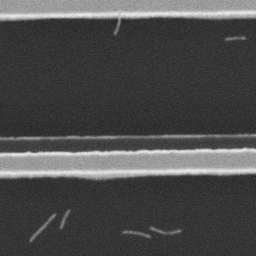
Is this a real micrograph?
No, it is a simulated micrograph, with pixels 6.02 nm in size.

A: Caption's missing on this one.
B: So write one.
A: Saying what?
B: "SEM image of lines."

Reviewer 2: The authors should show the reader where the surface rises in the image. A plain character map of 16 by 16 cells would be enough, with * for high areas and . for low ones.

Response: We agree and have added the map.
****************
................
................
................
................
................
................
................
...........*****
****************
****************
................
................
................
................
................